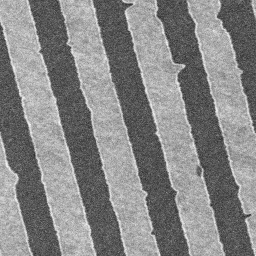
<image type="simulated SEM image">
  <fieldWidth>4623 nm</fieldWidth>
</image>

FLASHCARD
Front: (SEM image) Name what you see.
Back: parallel lines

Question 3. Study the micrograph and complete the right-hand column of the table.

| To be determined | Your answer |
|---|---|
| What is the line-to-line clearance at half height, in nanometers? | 556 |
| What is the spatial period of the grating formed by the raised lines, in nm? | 1120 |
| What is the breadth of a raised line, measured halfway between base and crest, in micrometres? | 0.558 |